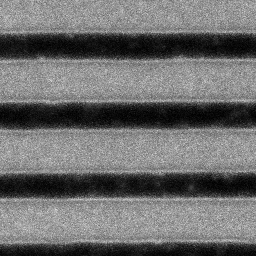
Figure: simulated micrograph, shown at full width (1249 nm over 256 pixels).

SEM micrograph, one or a few lines or trenches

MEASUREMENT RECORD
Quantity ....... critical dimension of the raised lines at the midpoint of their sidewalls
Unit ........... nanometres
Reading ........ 143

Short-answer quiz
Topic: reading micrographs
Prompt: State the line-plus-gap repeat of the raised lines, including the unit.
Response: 69.5 pixels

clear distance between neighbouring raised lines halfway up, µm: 0.197